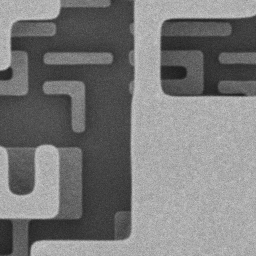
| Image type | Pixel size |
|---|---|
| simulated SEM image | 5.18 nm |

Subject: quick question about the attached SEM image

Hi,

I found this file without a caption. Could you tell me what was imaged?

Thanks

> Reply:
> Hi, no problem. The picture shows wiring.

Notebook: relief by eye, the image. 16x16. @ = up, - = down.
@@@@----@@@@@@@@
@-------@@------
@-------@@------
@-------@@------
--------@@------
--------@@------
--------@@@@@@@@
--------@@@@@@@@
--------@@@@@@@@
--@@----@@@@@@@@
--@@----@@@@@@@@
@-@@----@@@@@@@@
@@@@----@@@@@@@@
@@@-----@@@@@@@@
--------@@@@@@@@
--@@@@@@@@@@@@@@